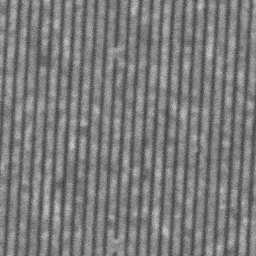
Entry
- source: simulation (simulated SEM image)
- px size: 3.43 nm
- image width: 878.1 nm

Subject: parallel lines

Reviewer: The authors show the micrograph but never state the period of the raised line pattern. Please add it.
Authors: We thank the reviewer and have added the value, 11 px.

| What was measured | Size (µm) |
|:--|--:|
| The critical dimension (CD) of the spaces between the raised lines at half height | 0.0158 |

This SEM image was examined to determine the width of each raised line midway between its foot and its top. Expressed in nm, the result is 21.8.